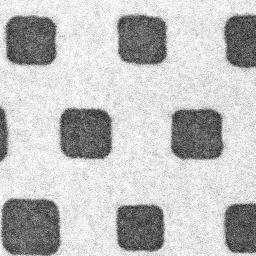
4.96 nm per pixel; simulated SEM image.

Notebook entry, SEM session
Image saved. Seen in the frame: holes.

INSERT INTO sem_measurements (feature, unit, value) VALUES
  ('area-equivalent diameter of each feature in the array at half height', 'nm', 276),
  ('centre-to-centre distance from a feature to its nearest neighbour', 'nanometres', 540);